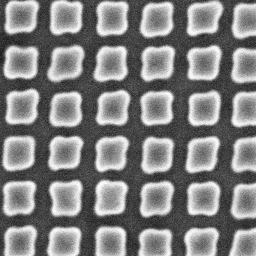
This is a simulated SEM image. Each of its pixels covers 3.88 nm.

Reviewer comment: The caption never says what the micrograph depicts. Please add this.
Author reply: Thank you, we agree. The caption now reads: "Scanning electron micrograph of a regular array of raised bodies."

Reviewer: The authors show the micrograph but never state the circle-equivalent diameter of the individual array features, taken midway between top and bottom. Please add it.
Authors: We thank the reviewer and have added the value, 129 nm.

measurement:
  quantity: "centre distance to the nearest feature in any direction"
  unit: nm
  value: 171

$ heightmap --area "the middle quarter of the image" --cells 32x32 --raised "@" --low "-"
@@@@----@@@@@@@-----@@@@@@@-----
@@@@----@@@@@@@-----@@@@@@@----@
@@@@----@@@@@@@-----@@@@@@-----@
--------@@@@@@@-----@@@---------
--------------------------------
--------------------------------
--------------------------------
-@@-------@@@@@@-----@@@@@@-----
@@@@-----@@@@@@@----@@@@@@@-----
@@@@-----@@@@@@@----@@@@@@@----@
@@@@-----@@@@@@@----@@@@@@@-----
@@@@-----@@@@@@@----@@@@@@@-----
@@@@-----@@@@@@@----@@@@@@@----@
@@@@----@@@@@@@@----@@@@@@@----@
@@@@-----@@@@@@-----@@@@@@------
--------------------------------
--------------------------------
--------------------------------
-@@@---------@@-----------------
@@@@-----@@@@@@@----@@@@@@@-----
@@@@----@@@@@@@@----@@@@@@@----@
@@@@----@@@@@@@-----@@@@@@@-----
@@@@-----@@@@@@-----@@@@@@@----@
@@@@----@@@@@@@-----@@@@@@@----@
@@@@----@@@@@@@-----@@@@@@@----@
@@@-----@@@@@@@-----@@@@@@-----@
---------@----------@@@@-------@
--------------------------------
--------------------------------
---------@@---------------------
@@@@-----@@@@@@-----@@@@@@@-----
@@@@----@@@@@@@-----@@@@@@@----@